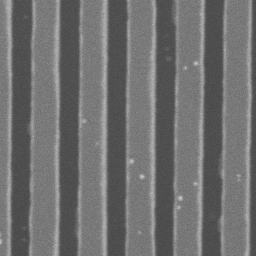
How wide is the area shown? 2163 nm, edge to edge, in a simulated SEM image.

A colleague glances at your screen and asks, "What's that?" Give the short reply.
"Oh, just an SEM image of lines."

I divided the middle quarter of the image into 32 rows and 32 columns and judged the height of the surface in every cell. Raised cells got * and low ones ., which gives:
....*******.....*******.....****
....*******.....*******.....****
....*******.....*******.....****
....*******.....*******.....****
....*******.....*******.....****
....*******.....*******.....****
....*******.....*******.....****
....*******.....*******.....****
....*******.....*******.....****
....*******.....*******.....****
....*******.....*******.....****
....*******.....*******.....****
....*******.....*******.....****
....*******.....*******.....****
....*******.....*******.....****
....*******.....*******.....****
....*******.....*******.....****
....*******.....*******.....****
....*******.....*******.....****
....*******.....*******.....****
....*******.....*******.....****
....*******.....*******.....****
....*******.....*******.....****
....*******.....*******.....****
....*******.....*******.....****
....******......*******.....****
....******......*******.....****
....*******.....*******.....****
....*******.....*******.....****
....*******.....*******.....****
....*******.....*******.....****
....******......*******.....****